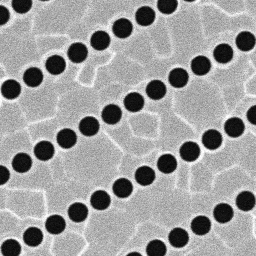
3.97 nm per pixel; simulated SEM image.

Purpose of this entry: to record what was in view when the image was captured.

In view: a regular array of holes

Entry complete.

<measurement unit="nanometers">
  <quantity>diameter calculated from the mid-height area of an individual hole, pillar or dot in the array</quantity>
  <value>80.2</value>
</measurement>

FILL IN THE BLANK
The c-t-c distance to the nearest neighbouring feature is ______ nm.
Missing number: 101